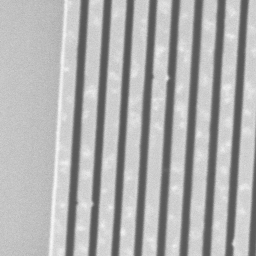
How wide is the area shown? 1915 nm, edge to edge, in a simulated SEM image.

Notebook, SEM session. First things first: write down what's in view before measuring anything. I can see parallel lines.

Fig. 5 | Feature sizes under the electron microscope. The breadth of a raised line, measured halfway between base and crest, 110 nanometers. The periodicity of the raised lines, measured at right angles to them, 170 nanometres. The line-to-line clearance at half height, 61.5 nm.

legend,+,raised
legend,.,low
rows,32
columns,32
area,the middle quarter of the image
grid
+++..++++..++++..+++..++++..++++
+++..++++..+++...+++..++++..+++.
+++..++++..+++..++++..++++..+++.
+++..++++..+++..++++..++++..++++
+++..++++..+++..++++..++++..++++
+++..+++...+++..++++..+++...+++.
+++..+++...+++..++++..+++...+++.
+++..+++...+++..++++..++++..+++.
+++..+++...+++..++++..++++..+++.
++...+++...+++..++++..+++...+++.
++...+++..++++..+++...+++..++++.
++...+++..++++..+++...+++..++++.
++...+++..++++..++++..+++..++++.
++...+++..++++..+++...+++..++++.
++..++++..++++..+++..++++..++++.
++..++++..++++..+++..++++..++++.
++..++++..++++..+++..++++..++++.
++..++++..++++..+++..++++..++++.
++..++++..+++..++++..++++..+++..
++..++++..+++..++++..++++..+++..
++..++++..+++..++++..++++..+++..
++..++++..+++..++++..++++..+++..
++..+++...+++..++++..++++..+++..
++..+++...+++..++++..++++..+++..
++..+++...+++..++++..++++..+++..
++..+++...+++..++++..++++..+++..
+...+++..++++..++++..+++..++++..
+...+++..++++..++++..+++..++++..
+...+++..++++..++++..+++..++++..
+...+++..++++..++++..+++..++++..
+..++++..++++..+++...+++..++++..
+..++++..++++..+++..++++..++++..